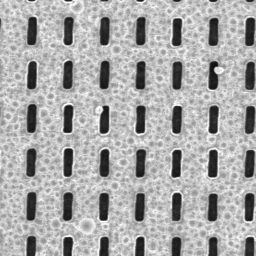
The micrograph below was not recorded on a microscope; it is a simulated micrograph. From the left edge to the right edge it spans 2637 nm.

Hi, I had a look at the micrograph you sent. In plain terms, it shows a regular array of holes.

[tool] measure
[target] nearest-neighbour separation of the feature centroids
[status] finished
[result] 372 nanometers